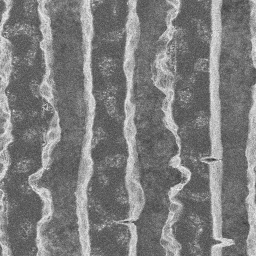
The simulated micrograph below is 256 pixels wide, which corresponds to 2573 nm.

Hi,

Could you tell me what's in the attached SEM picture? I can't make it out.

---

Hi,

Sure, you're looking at one or a few lines or trenches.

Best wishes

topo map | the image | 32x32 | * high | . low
.****......******.....*****.....
.****......******.....*****.....
******.....******....******.....
******.....******....******.....
******.....*****.....******.....
******.....*****.....******.....
******.....*****.....******.....
******.....*****....*******.....
******.....*****....*******.....
.*****.....*****....*******.....
.*****.....*****....*******.....
.*****.....*****.....******.....
******.....*****.....******.....
.******....*****.....******.....
.******....*****.....******.....
.******....*****.....******.....
.******....*****......*****.....
.******....*****......*****.....
******.....*****......*****.....
******.....*****......*****....*
*****......*****......*****....*
*****......*****.......****....*
****.......******......****.....
****......*******.....*****....*
******....*******....******....*
******....*******....******....*
******....*******....******.....
*****.....******.....******....*
*****.....*******....******....*
*****.....*******....******.....
*****......******....*******....
*****......******.....*****.....